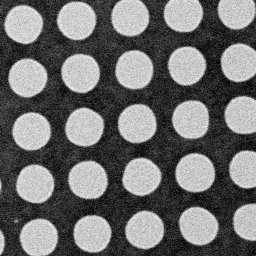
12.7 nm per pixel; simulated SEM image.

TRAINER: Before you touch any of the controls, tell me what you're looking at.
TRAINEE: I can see an array of small figures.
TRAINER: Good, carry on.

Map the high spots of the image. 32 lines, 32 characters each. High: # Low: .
.........##....###...####..#####
.####...####..####...####..#####
.####..#####..#####..####...###.
.####..#####..####....##.....#..
.####...###.....................
................................
................#.....###...####
...#....####...####..#####..####
.####...####...####..#####..####
.#####..####...####...###...###.
.#####..####...###.....#........
..###...........................
.............................###
................##....####..####
...##....###...####...####..####
..####..#####..####...####..####
..####..#####..####...####....##
..####...###....##..............
...##...........................
.......................##....###
..........##....###...####...###
...###...####...####..#####..###
..#####..####..#####..#####..###
..#####..####...###....###......
...###....##....................
................................
..................#....###....##
....#.....###...####...####..###
...####..#####..####...####..###
...####..#####..####...####...##
...####...###....##.....##......
...###..........................